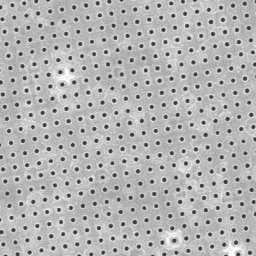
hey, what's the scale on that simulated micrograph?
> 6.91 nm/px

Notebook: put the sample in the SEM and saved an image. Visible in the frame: a regular array of holes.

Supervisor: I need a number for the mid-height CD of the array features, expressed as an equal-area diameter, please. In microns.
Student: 0.0312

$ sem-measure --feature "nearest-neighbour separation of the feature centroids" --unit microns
0.0824